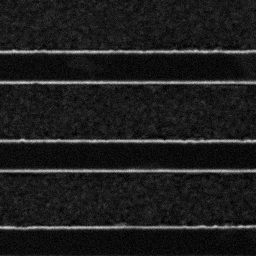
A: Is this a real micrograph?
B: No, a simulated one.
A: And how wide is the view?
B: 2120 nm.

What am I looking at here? lines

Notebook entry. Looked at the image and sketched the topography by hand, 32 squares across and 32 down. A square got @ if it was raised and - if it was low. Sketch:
--------------------------------
--------------------------------
--------------------------------
--------------------------------
--------------------------------
--------------------------------
@@@@@@@@@@@@@@@@@@@@@@@@@@@@@@@@
@@@@@@@@@@@@@@@@@@@@@@@@@@@@@@@@
@@@@@@@@@@@@@@@@@@@@@@@@@@@@@@@@
@@@@@@@@@@@@@@@@@@@@@@@@@@@@@@@@
--------------------------------
--------------------------------
--------------------------------
--------------------------------
--------------------------------
--------------------------------
--------------------------------
--@-----------------------------
@@@@@@@@@@@@@@@@@@@@@@@@@@@@@@@@
@@@@@@@@@@@@@@@@@@@@@@@@@@@@@@@@
@@@@@@@@@@@@@@@@@@@@@@@@@@@@@@@@
--------------------------------
--------------------------------
--------------------------------
--------------------------------
--------------------------------
--------------------------------
--------------------------------
@@@@@@@@@@@@@@@@@@@@@@@@@@@@@@@@
@@@@@@@@@@@@@@@@@@@@@@@@@@@@@@@@
@@@@@@@@@@@@@@@@@@@@@@@@@@@@@@@@
@@@@@@@@@@@@@@@@@@@@@@@@@@@@@@@@